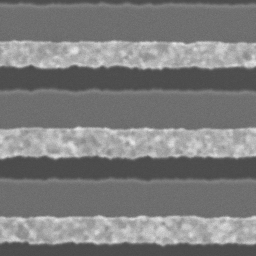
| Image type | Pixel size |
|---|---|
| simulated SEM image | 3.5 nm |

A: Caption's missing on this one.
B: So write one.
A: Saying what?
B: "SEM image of lines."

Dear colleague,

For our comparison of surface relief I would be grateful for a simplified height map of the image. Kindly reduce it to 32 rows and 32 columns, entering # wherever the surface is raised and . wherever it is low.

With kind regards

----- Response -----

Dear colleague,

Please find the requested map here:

..#.......#.#..#.....#..........
################################
################################
################################
################################
################################
################################
################################
.................###......#.....
................................
................................
#########.####.#############..##
################################
################################
################################
################################
################################
################################
################################
##.##.####..######.#####.#######
................................
................................
##.#..####...#####..####...#####
################################
################################
################################
################################
################################
################################
################################
......#.....#.......##.........#
................................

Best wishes